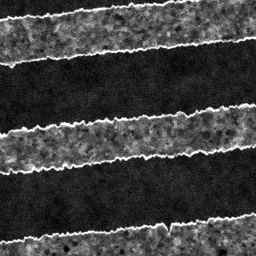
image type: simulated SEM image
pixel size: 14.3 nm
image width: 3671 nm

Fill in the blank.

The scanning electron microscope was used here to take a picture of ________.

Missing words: one or a few lines or trenches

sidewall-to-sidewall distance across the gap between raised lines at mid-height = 968 nm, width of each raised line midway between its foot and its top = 607 nanometers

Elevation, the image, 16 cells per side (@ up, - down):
-------@@@@@@@@@
@@@@@@@@@@@@@@@@
@@@@@@@@@@@@@@@-
@@@@@-----------
----------------
----------------
----------------
-------@@@@@@@@@
@@@@@@@@@@@@@@@@
@@@@@@@@@@@@@---
@@@@------------
----------------
----------------
---------------@
-------@@@@@@@@@
@@@@@@@@@@@@@@@@